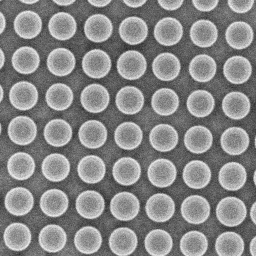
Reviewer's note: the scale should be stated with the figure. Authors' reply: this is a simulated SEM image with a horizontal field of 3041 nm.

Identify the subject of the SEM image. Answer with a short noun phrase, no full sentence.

an array of small figures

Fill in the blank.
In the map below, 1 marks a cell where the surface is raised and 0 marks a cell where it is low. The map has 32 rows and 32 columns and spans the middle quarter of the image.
11000111111101111111001111111001
11000111111000111111001111111001
10000011111000111111000111110000
00000000000000011100000011100000
00000000000000000000000000000000
10000011100000000000000000000000
11000111111000111110000011100000
11001111111001111110000111110000
11001111111001111111001111110001
11001111111001111111001111110001
10000111111001111111001111110001
00000011110000111110000111110001
00000000000000000000000011100000
00000000000000000000000000000000
00000011100000000000000000000000
10001111110000111100000111000000
11001111110001111110001111110001
11001111111001111110001111110001
11001111110001111110001111110011
10001111110001111110001111110011
00000111100000111100001111110001
00000000000000000000000011000001
00000000000000000000000000000000
00000111100000000000000000000000
10001111110001111100001111100000
10001111110001111110001111100001
10001111110011111110011111110011
10001111110011111110011111110011
00001111100001111110011111110011
00000011000000111100001111100011
00000000000000000000000111000001
00000000000000000000000000000000